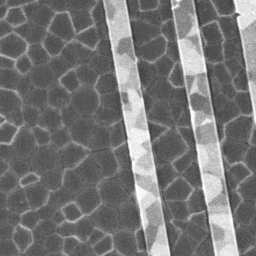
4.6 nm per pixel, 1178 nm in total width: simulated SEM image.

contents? one or a few lines or trenches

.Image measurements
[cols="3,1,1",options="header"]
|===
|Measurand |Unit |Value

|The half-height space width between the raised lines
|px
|45.2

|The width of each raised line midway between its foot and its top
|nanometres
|97.4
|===